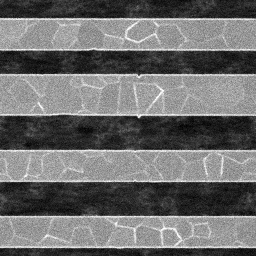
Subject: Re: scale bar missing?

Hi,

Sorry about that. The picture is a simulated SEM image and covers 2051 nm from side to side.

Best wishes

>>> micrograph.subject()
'one or a few lines or trenches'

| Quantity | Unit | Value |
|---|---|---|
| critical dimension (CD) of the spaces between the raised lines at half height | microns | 0.281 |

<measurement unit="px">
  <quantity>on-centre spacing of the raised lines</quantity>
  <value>65.8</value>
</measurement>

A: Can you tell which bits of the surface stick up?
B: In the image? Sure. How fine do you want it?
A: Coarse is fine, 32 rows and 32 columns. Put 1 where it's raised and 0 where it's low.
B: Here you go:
00000000000000000000000000000000
00000000000000000000000000000000
11111111111111111111111111111111
11111111111111111111111111111111
11111111111111111111111111111111
11111111111111111111111111111111
00000000000000000000000000000000
00000000000000000000000000000000
00000000000000000000000000000000
11111111111111111111111111111111
11111111111111111111111111111111
11111111111111111111111111111111
11111111111111111111111111111111
11111111111111111111111111111111
00001000000000000000000000000000
00000000000000000000000000000000
00000000000000000000000000000000
00000000000000000000000000000000
00000000000000000000000001000000
11111111111111111111111111111111
11111111111111111111111111111111
11111111111111111111111111111111
11111111111111111111111111111111
00000000000000000000000000000000
00000000000000000000000000000000
00000000000000000000000000000000
00000000000000000000000000000000
11111111111111111111111111111111
11111111111111111111111111111111
11111111111111111111111111111111
11111111111111111111111111111111
00000000000000000000000000000000